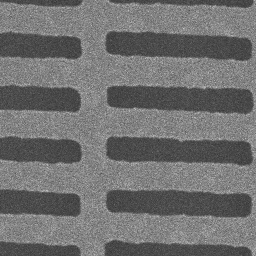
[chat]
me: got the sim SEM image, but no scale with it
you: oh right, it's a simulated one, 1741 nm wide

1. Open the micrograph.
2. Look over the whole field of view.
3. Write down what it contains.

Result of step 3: holes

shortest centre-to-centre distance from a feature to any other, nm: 355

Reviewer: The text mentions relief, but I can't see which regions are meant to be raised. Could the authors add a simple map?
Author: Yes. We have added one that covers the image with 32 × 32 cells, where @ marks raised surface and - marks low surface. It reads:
@@--------@@@@@-@@-@------------
@@@@@@@@@@@@@@@@@@@@@@@@@@@@@@@@
@@@@@@@@@@@@@@@@@@@@@@@@@@@@@@@@
@@@@@@@@@@@@@@@@@@@@@@@@@@@@@@@@
------@@@@@@@---------------@@@@
----------@@@------------------@
----------@@@-------------------
@@@@@@@@@@@@@@@@@@@@@@@@@@@-@--@
@@@@@@@@@@@@@@@@@@@@@@@@@@@@@@@@
@@@@@@@@@@@@@@@@@@@@@@@@@@@@@@@@
@@@@@@@@@@@@@@@@@@@@@@@@@@@@@@@@
----------@@@------------------@
----------@@@-------------------
----------@@@@@-@@--------------
@@@@@@@@@@@@@@@@@@@@@@@@@@@@@@@@
@@@@@@@@@@@@@@@@@@@@@@@@@@@@@@@@
@@@@@@@@@@@@@@@@@@@@@@@@@@@@@@@@
---------@@@@---------@-@-@@@@@@
----------@@@------------------@
----------@@@-------------------
@@@@@@@@@@@@@@@@@@@@@@@@@@@@@--@
@@@@@@@@@@@@@@@@@@@@@@@@@@@@@@@@
@@@@@@@@@@@@@@@@@@@@@@@@@@@@@@@@
@@@@@@@@@@@@@@@@@@@@@@@@@@@@@@@@
----------@@@------------------@
----------@@@-------------------
----------@@@@-----------------@
@@@@@@@@@@@@@@@@@@@@@@@@@@@@@@@@
@@@@@@@@@@@@@@@@@@@@@@@@@@@@@@@@
@@@@@@@@@@@@@@@@@@@@@@@@@@@@@@@@
------@@@@@@@----------@----@@@@
----------@@@------------------@